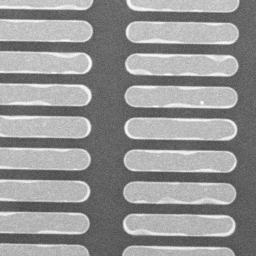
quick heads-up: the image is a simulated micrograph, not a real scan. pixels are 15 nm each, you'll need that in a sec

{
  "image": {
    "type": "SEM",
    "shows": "groups of lines, slits or small figures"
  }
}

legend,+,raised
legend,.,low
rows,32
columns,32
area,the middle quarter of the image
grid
++++++..........++++++++++++++++
++++++..........++++++++++++++++
......................++++++++..
................................
................................
++++............................
++++++..........++++++++++++++++
++++++.........+++++++++++++++++
++++++.........+++++++++++++++++
++++++..........++++++++++++++++
.................+++++++++......
................................
................................
+++++...........................
++++++..........++++++++++++++++
++++++..........++++++++++++++++
++++++..........++++++++++++++++
++++++..........++++++++++++++++
...................+++++++++++++
................................
................................
.++++...........................
++++++..........++++++++++++++++
++++++.........+++++++++++++++++
++++++.........+++++++++++++++++
++++++..........++++++++++++++++
.................+++++++++++++++
................................
................................
++++............................
++++++..........++++++++++++++++
++++++.........+++++++++++++++++